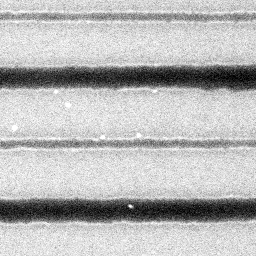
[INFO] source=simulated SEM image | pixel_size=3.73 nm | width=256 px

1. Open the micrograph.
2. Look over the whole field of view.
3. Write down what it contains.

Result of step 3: lines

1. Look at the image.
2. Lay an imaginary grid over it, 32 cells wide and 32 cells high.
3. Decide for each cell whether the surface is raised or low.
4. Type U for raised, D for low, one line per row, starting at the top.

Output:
DDDDDDDDDDDDDDDDDDDDDDDDDDDDDDDD
UUUUUUUUUDUUUUUUUUUUUUUUUDDDDUUU
UUUUUUUUUUUUUUUUUUUUUUUUUUUUUUUU
DDDDDDDDDDDDDDDDDDDDDDDDDDDDDDDD
DDDDDDDDDDDDDDDDDDDDDDDDDDDDDDDD
DDDDDDDDDDDDDDDDDDDDDDDDDDDDDDDD
DDDDDDDDDDDDDDDDDDDDDDDDDDDDDDDD
DDDDDDDDDDDDDDDDDDDDDDDDDDDDDDDD
UUUUUUUUUUUUUUUUUUUUUUUUUUUUUUUU
UUUUUUUUUUUUUUUUUUUUUUUUUUUUUUUU
UUUUUUUUUUUUUUUUUUUUUUUUUUUUUUUU
DDDDDDDDDDDDDDDDDDDDDDDDDDDDDDDD
DDDDDDDDDDDDDDDDDDDDDDDDDDDDDDDD
DDDDDDDDDDDDDDDDDDDDDDDDDDDDDDDD
DDDDDDDDDDDDDDDDDDDDDDDDDDDDDDDD
DDDDDDDDDDDDDDDDDDDDDDDDDDDDDDDD
DDDDDDDDDDDDDDDDDDDDDDDDDDDDDDDD
UUUUUUUUUUUUUUUUUUUUUUUUUUUUUUUU
UUUUUUUUUUUUUUUUUUUUUUUUUUUUUUUU
DDDDDDDDDDDDDDDDDDDDDDDDDDDDDDDD
DDDDDDDDDDDDDDDDDDDDDDDDDDDDDDDD
DDDDDDDDDDDDDDDDDDDDDDDDDDDDDDDD
DDDDDDDDDDDDDDDDDDDDDDDDDDDDDDDD
DDDDDDDDDDDDDDDDDDDDDDDDDDDDDDDD
DDDDDDDDDDDDDDDDDDDDDDDDDDDDDDDD
UUUUUUUUUUUUUUUUUUUUUUUUUUUUUUUU
UUUUUUUUUUUUUUUUUUUUUUUUUUUUUUUU
UUUUUUUUUUUUUUUUUUUUUUUUUUUUUUUU
DDDDDDDDDDDDDDDDDDDDDDDDDDDDDDDD
DDDDDDDDDDDDDDDDDDDDDDDDDDDDDDDD
DDDDDDDDDDDDDDDDDDDDDDDDDDDDDDDD
DDDDDDDDDDDDDDDDDDDDDDDDDDDDDDDD